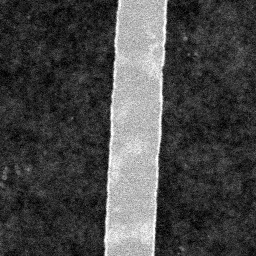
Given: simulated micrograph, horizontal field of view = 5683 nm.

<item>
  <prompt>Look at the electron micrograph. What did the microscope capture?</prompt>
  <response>one or a few lines or trenches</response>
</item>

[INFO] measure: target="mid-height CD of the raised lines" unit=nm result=1070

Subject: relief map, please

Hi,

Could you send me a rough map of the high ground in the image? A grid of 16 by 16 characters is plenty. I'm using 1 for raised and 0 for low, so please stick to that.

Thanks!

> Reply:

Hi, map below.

0000000111000000
0000000111000000
0000000111000000
0000000111000000
0000000111000000
0000000111000000
0000000111000000
0000000111000000
0000000111000000
0000000111000000
0000000111000000
0000000111000000
0000000111000000
0000000111000000
0000000111000000
0000000111000000